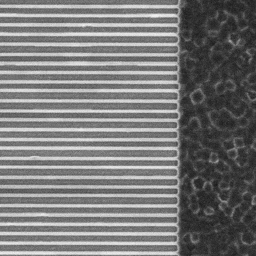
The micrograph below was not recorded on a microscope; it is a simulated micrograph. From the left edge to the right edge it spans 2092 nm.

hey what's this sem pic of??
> parallel lines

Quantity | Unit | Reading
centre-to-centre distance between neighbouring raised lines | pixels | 9.49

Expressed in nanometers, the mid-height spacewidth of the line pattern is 54.1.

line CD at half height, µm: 0.0235